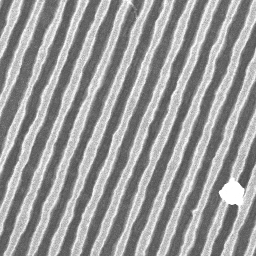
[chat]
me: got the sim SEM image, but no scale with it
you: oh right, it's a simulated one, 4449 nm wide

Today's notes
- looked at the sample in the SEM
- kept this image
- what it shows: parallel lines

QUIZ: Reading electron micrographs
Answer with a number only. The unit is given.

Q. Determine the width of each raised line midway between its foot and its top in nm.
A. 179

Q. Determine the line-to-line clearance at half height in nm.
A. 181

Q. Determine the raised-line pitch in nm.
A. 353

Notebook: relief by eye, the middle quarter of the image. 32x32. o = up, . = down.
..ooo...ooo...oo...oo....oo...oo
..ooo...ooo..ooo...oo...ooo...oo
..ooo...oo...ooo..ooo...ooo..ooo
..oo...ooo...oo...ooo...oo...oo.
.ooo...ooo..ooo...oo...ooo..ooo.
.ooo..ooo...ooo..ooo...ooo..ooo.
ooo...oo....oo...ooo..ooo...oo..
ooo...oo...ooo..ooo...ooo..ooo..
ooo..ooo...oo...ooo...oo...ooo..
oo...oo...ooo...oo...ooo..ooo...
oo..ooo...oo...ooo...ooo..ooo..o
o...oo....oo...oo...ooo...ooo..o
o..ooo...ooo...oo...ooo...oo...o
...ooo...oo...ooo...oo...ooo..oo
...oo...ooo...oo...ooo...ooo..oo
..ooo...ooo..ooo...oo...ooo..ooo
..ooo..ooo...ooo..ooo...ooo..ooo
.ooo...ooo..ooo...ooo...oo...ooo
.ooo...ooo..ooo...ooo..ooo..ooo.
.ooo..ooo...oo...ooo...ooo..ooo.
.oo...ooo...oo...ooo..ooo...ooo.
ooo..ooo...ooo...ooo..ooo..ooo..
oo...ooo...oo...ooo..ooo...ooo..
oo...ooo...oo...ooo..ooo...ooo..
o...ooo...ooo...oo...oo...ooo...
o...ooo...ooo...oo...oo...ooo...
o..ooo...ooo...oo...ooo..ooo...o
o..ooo...ooo..ooo...oo...ooo...o
...ooo..ooo...ooo..ooo...ooo..oo
...oo...ooo..ooo...oo...ooo...oo
..ooo..ooo...ooo...oo...ooo...oo
..ooo..ooo..ooo...ooo...oo...ooo